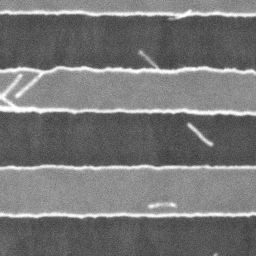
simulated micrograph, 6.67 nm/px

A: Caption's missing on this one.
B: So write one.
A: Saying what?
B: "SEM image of lines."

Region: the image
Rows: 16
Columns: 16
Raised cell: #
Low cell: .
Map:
################
................
................
................
################
################
################
................
................
................
################
################
################
###.##...#.#....
................
................